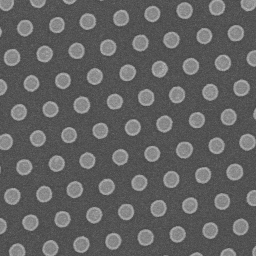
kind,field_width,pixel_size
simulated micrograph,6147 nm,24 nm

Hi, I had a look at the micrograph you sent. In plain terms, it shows a regular array of raised bodies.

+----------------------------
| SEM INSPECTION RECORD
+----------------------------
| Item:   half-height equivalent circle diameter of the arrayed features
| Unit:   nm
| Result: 362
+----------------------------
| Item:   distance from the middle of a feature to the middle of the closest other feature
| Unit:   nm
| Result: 750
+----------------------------